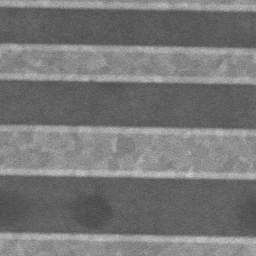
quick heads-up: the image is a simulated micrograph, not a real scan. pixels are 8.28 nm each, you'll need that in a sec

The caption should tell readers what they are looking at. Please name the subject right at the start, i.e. one or a few lines or trenches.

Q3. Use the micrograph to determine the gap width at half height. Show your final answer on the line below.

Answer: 430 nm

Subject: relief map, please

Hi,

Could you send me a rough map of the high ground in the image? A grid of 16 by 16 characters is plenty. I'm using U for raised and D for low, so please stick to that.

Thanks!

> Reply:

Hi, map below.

DDDDDDDDDDDDDDDD
DDDDDDDDDDDDDDDD
DDDDDDDDDDDDDDDD
UUUUUUUUUUUUUUUU
UUUUUUUUUUUUUUUU
DDDDDDDDDDDDDDDD
DDDDDDDDDDDDDDDD
DDDDDDDDDDDDDDDD
UUUUUUUUUUUUUUUU
UUUUUUUUUUUUUUUU
UUUUUUUUUUUUUUUU
DDDDDDDDDDDDDDDD
DDDDDDDDDDDDDDDD
DDDDDDDDDDDDDDDD
DDDDDDDDDDDDDDDD
UUUUUUUUUUUUUUUU